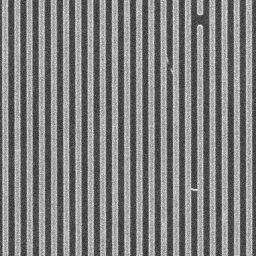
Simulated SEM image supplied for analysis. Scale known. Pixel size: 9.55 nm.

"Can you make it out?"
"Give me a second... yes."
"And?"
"parallel lines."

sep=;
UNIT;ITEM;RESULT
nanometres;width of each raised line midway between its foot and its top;51.4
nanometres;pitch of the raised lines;116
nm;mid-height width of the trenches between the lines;66.9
